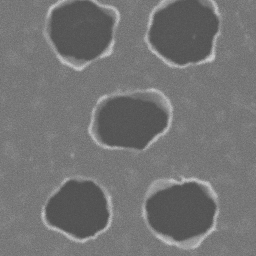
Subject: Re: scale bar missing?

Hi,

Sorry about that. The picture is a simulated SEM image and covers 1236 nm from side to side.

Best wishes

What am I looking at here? holes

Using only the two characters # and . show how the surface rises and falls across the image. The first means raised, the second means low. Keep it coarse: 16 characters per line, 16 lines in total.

####...###...###
###....##.....##
###....##....###
####..####...###
################
################
######....######
######....######
######....######
################
################
####..#####.####
###....##....###
###....##....###
####..####...###
################